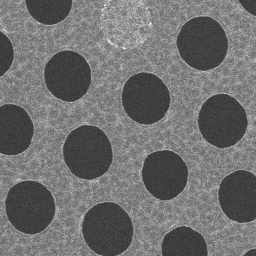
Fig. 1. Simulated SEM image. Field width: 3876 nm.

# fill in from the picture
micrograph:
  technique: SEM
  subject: holes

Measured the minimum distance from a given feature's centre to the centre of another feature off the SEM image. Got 1190 nm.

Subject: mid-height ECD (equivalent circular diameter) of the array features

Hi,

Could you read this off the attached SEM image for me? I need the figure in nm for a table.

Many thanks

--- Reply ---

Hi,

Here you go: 780